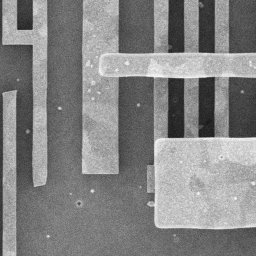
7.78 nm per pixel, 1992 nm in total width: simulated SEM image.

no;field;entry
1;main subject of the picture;wiring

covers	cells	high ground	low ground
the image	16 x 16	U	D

DDDDDDDDDDDDDDDD
DDDDDDDDDDDDDDDD
DDDDDDDDDDDDDDDD
DDDDDDDUUUUUUUUU
DDDDDDUUUUUUUUUU
DDDDDDDDDDDDDDDD
DDDDDDDDDDDDDDDD
DDDDDDDDDDDDDDDD
DDDDDDDDDDDDDDDD
DDDDDDDDDDUUUUUU
DDDDDDDDDDUUUUUU
DDDDDDDDDDUUUUUU
DDDDDDDDDDUUUUUU
DDDDDDDDDDUUUUUU
DDDDDDDDDDDDDDDD
DDDDDDDDDDDDDDDD